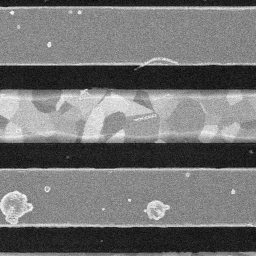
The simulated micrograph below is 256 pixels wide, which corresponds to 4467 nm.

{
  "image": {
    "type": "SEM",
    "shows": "lines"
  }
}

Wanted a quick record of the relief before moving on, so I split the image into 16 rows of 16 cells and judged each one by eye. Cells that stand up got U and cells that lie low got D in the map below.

UUUUUUUUUUUUUUUU
UUUUUUUUUUUUUUUU
UUUUUUUUUUUUUUUU
UUUUUUUUUUUUUUUU
DDDDDDDDDDDDDDDD
DDDDDDDDDDDDDDDD
UUUUUUUUUUUUUUUU
UUUUUUUUUUUUUUUU
UUUUUUUUUUUUUUUU
DDDDDDDDDDDDDDDD
DDDDDDDDDDDDDDDD
UUUUUUUUUUUUUUUU
UUUUUUUUUUUUUUUU
UUUUUUUUUUUUUUUU
DDDDDDDDDDDDDDDD
DDDDDDDDDDDDDDDD